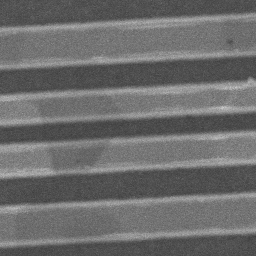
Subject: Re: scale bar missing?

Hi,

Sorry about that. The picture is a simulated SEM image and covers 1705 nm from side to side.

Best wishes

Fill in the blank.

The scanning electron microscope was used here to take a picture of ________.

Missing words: one or a few lines or trenches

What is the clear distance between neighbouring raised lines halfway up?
29.7 px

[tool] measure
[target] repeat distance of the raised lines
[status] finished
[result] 395 nm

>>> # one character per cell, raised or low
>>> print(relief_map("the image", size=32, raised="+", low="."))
................................
................................
......................++++++++++
.....+++++++++++++++++++++++++++
++++++++++++++++++++++++++++++++
++++++++++++++++++++++++++++++++
++++++++++++++++++++++++++++++++
++++++++++++++++................
................................
................................
..............................++
.............+++++++++++++++++++
++++++++++++++++++++++++++++++++
++++++++++++++++++++++++++++++++
++++++++++++++++++..............
................................
................................
.................+++++++++++++++
++++++++++++++++++++++++++++++++
++++++++++++++++++++++++++++++++
++++++++++++++++++++++++++......
++++++++........................
................................
................................
.............................+++
............++++++++++++++++++++
++++++++++++++++++++++++++++++++
++++++++++++++++++++++++++++++++
++++++++++++++++++++++++++++++++
+++++++++++++++++++.............
+++.............................
................................